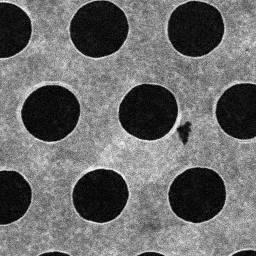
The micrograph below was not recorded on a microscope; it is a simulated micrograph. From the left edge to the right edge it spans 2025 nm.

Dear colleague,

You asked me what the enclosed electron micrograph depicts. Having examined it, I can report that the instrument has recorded holes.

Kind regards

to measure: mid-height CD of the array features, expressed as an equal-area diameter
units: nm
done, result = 453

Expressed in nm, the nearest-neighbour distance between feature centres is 628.